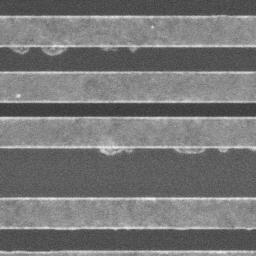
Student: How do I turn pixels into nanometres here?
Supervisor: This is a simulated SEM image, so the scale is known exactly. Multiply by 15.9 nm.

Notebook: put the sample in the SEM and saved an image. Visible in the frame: lines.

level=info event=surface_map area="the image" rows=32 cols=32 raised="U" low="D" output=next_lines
DDDDDDDDDDDDDDDDDDDDDDDDDDDDDDDD
DDDDDDDDDDDDDDDDDDDDDDDDDDDDDDDD
UUUUUUUUUUUUUUUUUUUUUUUUUUUUUUUU
UUUUUUUUUUUUUUUUUUUUUUUUUUUUUUUU
UUUUUUUUUUUUUUUUUUUUUUUUUUUUUUUU
UUUUUUUUUUUUUUUUUUUUUUUUUUUUUUUU
DDDDDDDDDDDDDDDDDDDDDDDDDDDDDDDD
DDDDDDDDDDDDDDDDDDDDDDDDDDDDDDDD
DDDDDDDDDDDDDDDDDDDDDDDDDDDDDDDD
UUUUUUUUUUUUUUUUUUUUUUUUUUUUUUUU
UUUUUUUUUUUUUUUUUUUUUUUUUUUUUUUU
UUUUUUUUUUUUUUUUUUUUUUUUUUUUUUUU
UUUUUUUUUUUUUUUUUUUUUUUUUUUUUUUU
DDDDDDDDDDDDDDDDDDDDDDDDDDDDDDDD
DDDDDDDDDDDDDDDDDDDDDDDDDDDDDDDD
UUUUUUUUUUUUUUUUUUUUUUUUUUUUUUUU
UUUUUUUUUUUUUUUUUUUUUUUUUUUUUUUU
UUUUUUUUUUUUUUUUUUUUUUUUUUUUUUUU
DDDDDDDDDDDDDDDDDDDDDDDDDDDDDDDD
DDDDDDDDDDDDDDDDDDDDDDDDDDDDDDDD
DDDDDDDDDDDDDDDDDDDDDDDDDDDDDDDD
DDDDDDDDDDDDDDDDDDDDDDDDDDDDDDDD
DDDDDDDDDDDDDDDDDDDDDDDDDDDDDDDD
DDDDDDDDDDDDDDDDDDDDDDDDDDDDDDDD
DDDDDDDDDDDDDDDDDDDDDDDDDDDDDDDD
UUUUUUUUUUUUUUUUUUUUUUUUUUUUUUUU
UUUUUUUUUUUUUUUUUUUUUUUUUUUUUUUU
UUUUUUUUUUUUUUUUUUUUUUUUUUUUUUUU
UUUUUUUUUUUUUUUUUUUUUUUUUUUUUUUU
DDDDDDDDDDDDDDDDDDDDDDDDDDDDDDDD
DDDDDDDDDDDDDDDDDDDDDDDDDDDDDDDD
DDDDDDDUUUUUUUUUUUUUUUUUUUUUUUUU